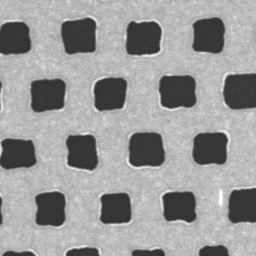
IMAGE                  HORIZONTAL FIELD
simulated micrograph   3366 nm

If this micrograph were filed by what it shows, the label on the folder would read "a regular array of holes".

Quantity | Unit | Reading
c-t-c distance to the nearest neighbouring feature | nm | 839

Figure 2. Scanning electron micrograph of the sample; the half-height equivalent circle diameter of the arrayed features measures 481 nm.